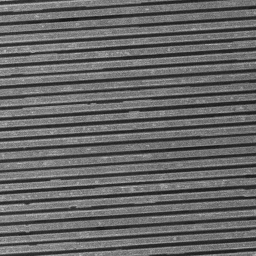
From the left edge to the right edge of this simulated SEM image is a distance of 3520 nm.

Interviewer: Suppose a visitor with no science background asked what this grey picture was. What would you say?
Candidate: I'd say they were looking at parallel lines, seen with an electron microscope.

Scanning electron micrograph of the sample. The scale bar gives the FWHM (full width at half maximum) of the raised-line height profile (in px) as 6.73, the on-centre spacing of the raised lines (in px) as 10.5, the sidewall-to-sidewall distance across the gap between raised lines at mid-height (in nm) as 53.1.